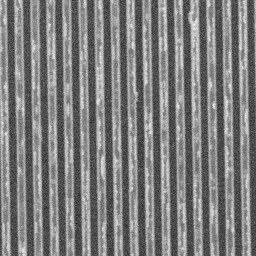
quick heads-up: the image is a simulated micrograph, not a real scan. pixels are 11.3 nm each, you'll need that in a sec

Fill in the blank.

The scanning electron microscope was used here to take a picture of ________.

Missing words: parallel lines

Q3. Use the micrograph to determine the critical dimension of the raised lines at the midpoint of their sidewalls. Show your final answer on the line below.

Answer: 79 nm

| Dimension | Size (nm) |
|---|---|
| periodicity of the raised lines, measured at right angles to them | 180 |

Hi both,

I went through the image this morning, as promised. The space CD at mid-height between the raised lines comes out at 100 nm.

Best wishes